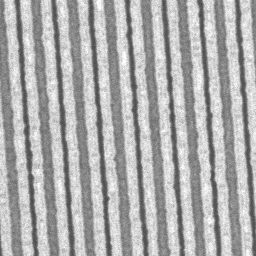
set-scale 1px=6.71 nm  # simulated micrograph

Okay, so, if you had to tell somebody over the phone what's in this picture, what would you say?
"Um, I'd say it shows parallel lines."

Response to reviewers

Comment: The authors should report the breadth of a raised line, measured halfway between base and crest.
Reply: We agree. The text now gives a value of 67.8 nm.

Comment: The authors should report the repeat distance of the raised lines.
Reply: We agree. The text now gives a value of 122 nm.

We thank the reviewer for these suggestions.